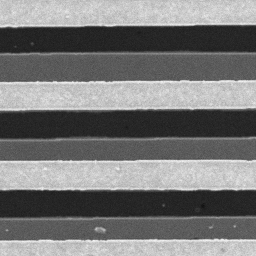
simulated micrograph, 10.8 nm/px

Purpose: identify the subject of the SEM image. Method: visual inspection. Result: lines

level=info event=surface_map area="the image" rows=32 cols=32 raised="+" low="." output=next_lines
++++++++++++++++++++++++++++++++
++++++++++++++++++++++++++++++++
++++++++++++++++++++++++++++++++
................................
................................
................................
................................
++++++++++++++++++++++++++++++++
++++++++++++++++++++++++++++++++
++++++++++++++++++++++++++++++++
++++++++++++++++++++++++++++++++
++++++++++++++++++++++++++++++++
++++++++++++++++++++++++++++++++
++++++++++++++++++++++++++++++++
................................
................................
................................
......++++++++++++++++++++++++++
++++++++++++++++++++++++++++++++
++++++++++++++++++++++++++++++++
++++++++++++++++++++++++++++++++
++++++++++++++++++++++++++++++++
++++++++++++++++++++++++++++++++
++++++++++++++++++++++++++++++++
................................
................................
................................
++++++++++++++++++++++++++++++++
++++++++++++++++++++++++++++++++
++++++++++++++++++++++++++++++++
++++++++++++++++++++++++++++++++
++++++++++++++++++++++++++++++++